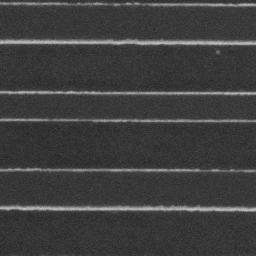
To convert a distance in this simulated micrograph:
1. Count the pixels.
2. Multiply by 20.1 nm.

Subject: lines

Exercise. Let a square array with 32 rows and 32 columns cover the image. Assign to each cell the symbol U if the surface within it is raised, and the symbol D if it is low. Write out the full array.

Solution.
UUUUUUUUDDDUUDDDUDDDDDDDDDDDDDDD
UUUUUUUUUUUUUUUUUUUUUUUUUUUUUUUU
UUUUUUUUUUUUUUUUUUUUUUUUUUUUUUUU
UUUUUUUUUUUUUUUUUUUUUUUUUUUUUUUU
UUUUUUUUUUUUUUUUUUUUUUUUUUUUUUUU
DDDDDDDDDDDDDDDDDDDDDDDDDDDDDDDD
DDDDDDDDDDDDDDDDDDDDDDDDDDDDDDDD
DDDDDDDDDDDDDDDDDDDDDDDDDDDDDDDD
DDDDDDDDDDDDDDDDDDDDDDDDDDDDDDDD
DDDDDDDDDDDDDDDDDDDDDDDDDDDDDDDD
DDDDDDDDDDDDDDDDDDDDDDDDDDDDDDDD
DDDDDDDDDDDDDDDDDDDDDDDDDDDDDDDD
UUUUUUUUUUUUUUUUUUUUUUUUUUUUUUUU
UUUUUUUUUUUUUUUUUUUUUUUUUUUUUUUU
UUUUUUUUUUUUUUUUUUUUUUUUUUUUUUUU
DDDDDDDDDDDDDDDDDDDDDDDDDDDDDDDD
DDDDDDDDDDDDDDDDDDDDDDDDDDDDDDDD
DDDDDDDDDDDDDDDDDDDDDDDDDDDDDDDD
DDDDDDDDDDDDDDDDDDDDDDDDDDDDDDDD
DDDDDDDDDDDDDDDDDDDDDDDDDDDDDDDD
DDDDDDDDDDDDDDDDDDDDDDDDDDDDDDDD
UUUUUUUUUUUUUUUUUUUUUUUUUUUUUUUU
UUUUUUUUUUUUUUUUUUUUUUUUUUUUUUUU
UUUUUUUUUUUUUUUUUUUUUUUUUUUUUUUU
UUUUUUUUUUUUUUUUUUUUUUUUUUUUUUUU
UUUUUUUUUUUUUUUUUUUUUUUUUUUUUUUU
DDDDDDDDDDDDDDDDDDDDDDDDDDDDDDDD
DDDDDDDDDDDDDDDDDDDDDDDDDDDDDDDD
DDDDDDDDDDDDDDDDDDDDDDDDDDDDDDDD
DDDDDDDDDDDDDDDDDDDDDDDDDDDDDDDD
DDDDDDDDDDDDDDDDDDDDDDDDDDDDDDDD
DDDDDDDDDDDDDDDDDDDDDDDDDDDDDDDD